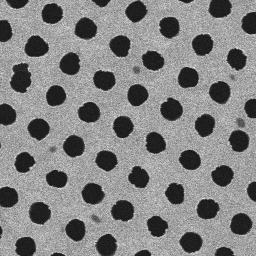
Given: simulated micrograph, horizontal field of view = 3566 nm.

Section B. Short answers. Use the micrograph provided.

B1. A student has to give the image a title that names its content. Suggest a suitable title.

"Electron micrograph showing a regular array of holes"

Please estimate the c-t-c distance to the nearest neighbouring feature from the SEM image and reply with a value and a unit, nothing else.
504 nanometres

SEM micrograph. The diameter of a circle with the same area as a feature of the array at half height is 293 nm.